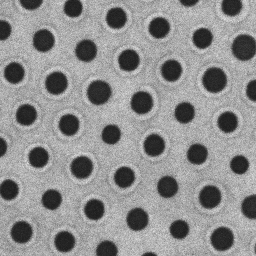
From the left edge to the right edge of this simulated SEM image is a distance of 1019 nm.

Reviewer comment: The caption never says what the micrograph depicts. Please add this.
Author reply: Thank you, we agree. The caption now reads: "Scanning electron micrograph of a regular array of holes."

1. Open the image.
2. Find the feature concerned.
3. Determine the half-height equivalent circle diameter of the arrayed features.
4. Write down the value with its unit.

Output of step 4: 19.4 pixels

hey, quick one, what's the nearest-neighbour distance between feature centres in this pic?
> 174 nm